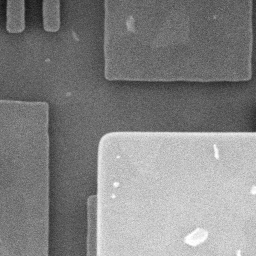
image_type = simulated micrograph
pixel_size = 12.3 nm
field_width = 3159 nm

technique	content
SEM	wiring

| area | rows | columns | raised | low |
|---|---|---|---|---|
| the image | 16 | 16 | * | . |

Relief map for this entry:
................
................
................
................
................
................
................
................
.......*********
......**********
......**********
......**********
......**********
......**********
......**********
......**********